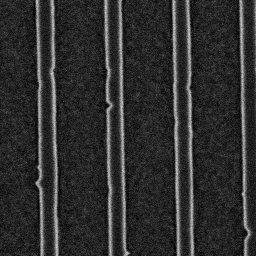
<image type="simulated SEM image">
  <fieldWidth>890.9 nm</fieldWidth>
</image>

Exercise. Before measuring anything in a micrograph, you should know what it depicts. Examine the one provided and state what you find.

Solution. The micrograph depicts one or a few lines or trenches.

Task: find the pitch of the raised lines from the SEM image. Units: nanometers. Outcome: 237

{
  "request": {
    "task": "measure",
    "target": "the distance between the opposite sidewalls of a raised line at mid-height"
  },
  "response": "54.4 nanometres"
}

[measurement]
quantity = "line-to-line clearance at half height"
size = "181 nanometers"